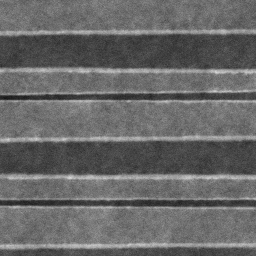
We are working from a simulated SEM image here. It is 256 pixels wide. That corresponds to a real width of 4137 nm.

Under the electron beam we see lines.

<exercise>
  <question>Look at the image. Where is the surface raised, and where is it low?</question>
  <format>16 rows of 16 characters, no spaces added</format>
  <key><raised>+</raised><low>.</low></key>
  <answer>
++++++++++++++++
++++++++++++++++
................
................
+++++++++++.....
++++++++++++++++
++++++++++++++++
++++++++++++++++
++++++++++++++++
................
................
++++++++++++++++
++++++++++++++++
++++++++++++++++
++++++++++++++++
................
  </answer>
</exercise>